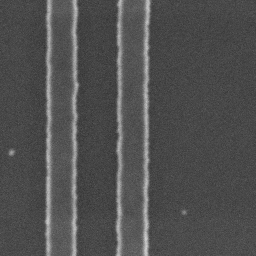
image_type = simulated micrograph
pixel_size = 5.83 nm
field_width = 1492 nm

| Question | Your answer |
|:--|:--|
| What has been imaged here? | lines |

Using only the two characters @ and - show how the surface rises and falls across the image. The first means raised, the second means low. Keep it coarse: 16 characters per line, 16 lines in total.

---@@--@@-------
---@@--@@-------
---@@--@@-------
---@@--@@-------
---@@--@@-------
---@@--@@-------
---@@--@@-------
---@@--@@-------
---@@--@@-------
---@@--@@-------
---@@--@@-------
---@@--@@-------
---@@--@@-------
---@@--@@-------
---@@--@@-------
---@@--@@-------